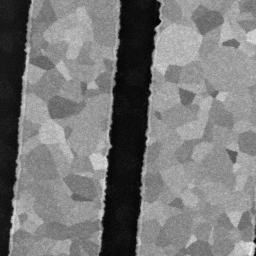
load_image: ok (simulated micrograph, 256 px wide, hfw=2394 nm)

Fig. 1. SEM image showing one or a few lines or trenches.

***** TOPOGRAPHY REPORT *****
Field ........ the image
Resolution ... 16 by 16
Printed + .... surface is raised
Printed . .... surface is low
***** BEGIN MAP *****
..+++++...++++++
..+++++...++++++
..+++++...++++++
..+++++...++++++
..+++++..+++++++
..+++++..+++++++
.++++++..+++++++
.++++++..+++++++
.++++++..+++++++
.++++++..+++++++
.++++++..+++++++
.++++++..+++++++
.++++++..+++++++
.+++++...+++++++
.+++++...+++++++
.+++++...+++++++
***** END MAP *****